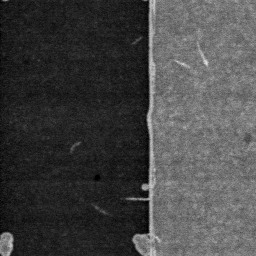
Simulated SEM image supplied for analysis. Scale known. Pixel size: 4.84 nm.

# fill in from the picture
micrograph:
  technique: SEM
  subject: one or a few lines or trenches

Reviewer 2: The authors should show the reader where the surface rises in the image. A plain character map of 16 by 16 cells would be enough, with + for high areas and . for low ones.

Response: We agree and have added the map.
.........+++++++
.........+++++++
.........+++++++
.........+++++++
.........+++++++
.........+++++++
.........+++++++
.........+++++++
.........+++++++
.........+++++++
.........+++++++
.........+++++++
.........+++++++
.........+++++++
.........+++++++
.........+++++++